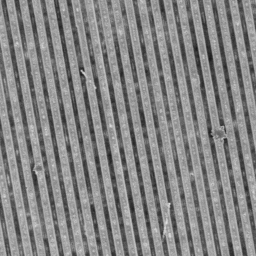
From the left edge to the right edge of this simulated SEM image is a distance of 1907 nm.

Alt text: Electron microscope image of parallel lines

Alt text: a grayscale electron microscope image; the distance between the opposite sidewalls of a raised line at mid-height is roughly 57.8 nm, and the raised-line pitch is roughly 96.2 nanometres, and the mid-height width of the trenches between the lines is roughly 35.8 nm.